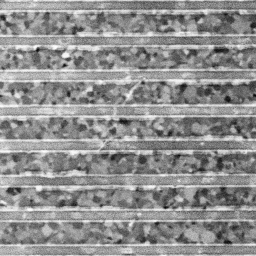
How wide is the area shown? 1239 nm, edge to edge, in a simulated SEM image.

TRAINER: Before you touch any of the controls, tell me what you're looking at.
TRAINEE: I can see parallel lines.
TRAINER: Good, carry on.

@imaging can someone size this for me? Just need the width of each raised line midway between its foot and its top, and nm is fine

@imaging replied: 119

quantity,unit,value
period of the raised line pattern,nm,169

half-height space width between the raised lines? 53.3 nanometres